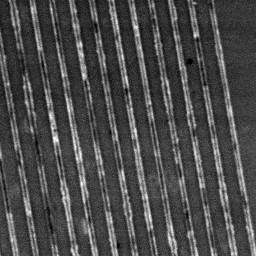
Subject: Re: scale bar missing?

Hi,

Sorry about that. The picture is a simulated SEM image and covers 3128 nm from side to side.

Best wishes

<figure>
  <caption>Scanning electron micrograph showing parallel lines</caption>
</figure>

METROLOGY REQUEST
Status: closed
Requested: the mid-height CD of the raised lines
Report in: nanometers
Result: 58.7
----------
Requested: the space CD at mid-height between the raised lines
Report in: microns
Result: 0.178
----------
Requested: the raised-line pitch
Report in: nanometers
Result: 239